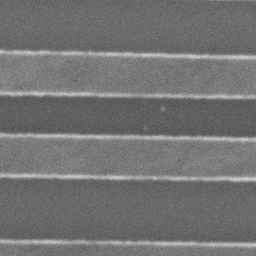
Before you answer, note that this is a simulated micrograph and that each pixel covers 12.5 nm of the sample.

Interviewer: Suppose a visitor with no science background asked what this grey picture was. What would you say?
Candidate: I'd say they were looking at lines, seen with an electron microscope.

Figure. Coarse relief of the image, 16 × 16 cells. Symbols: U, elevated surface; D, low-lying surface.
DDDDDDDDDDDDDDDD
DDDDDDDDDDDDDDDD
DDDDDDDDDDDDDDDD
UUUUUUUUUUUUUDDD
UUUUUUUUUUUUUUUU
UUUUUUUUUUUUUUUU
DDDDDDDDDDDDDDDD
DDDDDDDDDDDDDDDD
UUUUUUDDDDDDDDDD
UUUUUUUUUUUUUUUU
UUUUUUUUUUUUUUUU
DDDDDDDDDDDDDDDD
DDDDDDDDDDDDDDDD
DDDDDDDDDDDDDDDD
DDDDDDDDDDDDDDDD
UUUUUUUUUUUUUUUU